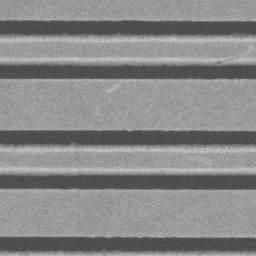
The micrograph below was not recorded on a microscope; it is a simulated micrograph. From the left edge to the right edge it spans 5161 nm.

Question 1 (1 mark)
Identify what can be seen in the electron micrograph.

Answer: lines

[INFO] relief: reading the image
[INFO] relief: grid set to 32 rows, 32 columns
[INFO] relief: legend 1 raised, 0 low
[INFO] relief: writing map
11111111111111111111111111111111
11111111111111111111111111111111
00000100101011100111111111111111
00000000000000000000000000000000
00000000000000000000000000000000
11111111111111111111111111111111
11111111111111111111111111111111
11111111111111111111111111111111
00000000000000000000000000000000
00000000000000000000000000000000
11111111111111111111111111111111
11111111111111111111111111111111
11111111111111111111111111111111
11111111111111111111111111111111
11111111111111111111111111111111
11111111111111111111111111111111
00000000000000000000000000000000
00000000000000000000000000000000
11111111111111111111111111111111
11111111111111111111111111111111
11111111111111111111111111111111
11111111111111111111111111111111
00000000000000000000000000000000
00000000000000000000000000000000
11111111111111111111111111111111
11111111111111111111111111111111
11111111111111111111111111111111
11111111111111111111111111111111
11111111111111111111111111111111
11111111111111111111111111111111
00000000000000000000000000000000
00000000000000000000000000000000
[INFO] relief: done